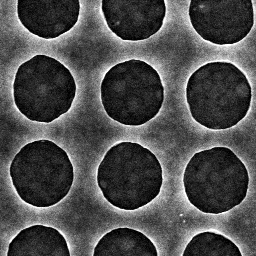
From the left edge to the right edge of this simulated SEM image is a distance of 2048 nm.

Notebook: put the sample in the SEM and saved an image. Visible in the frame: holes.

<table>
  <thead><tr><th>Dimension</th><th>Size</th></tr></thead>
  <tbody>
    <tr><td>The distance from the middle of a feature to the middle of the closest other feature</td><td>677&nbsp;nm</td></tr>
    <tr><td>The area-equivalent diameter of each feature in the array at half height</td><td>0.524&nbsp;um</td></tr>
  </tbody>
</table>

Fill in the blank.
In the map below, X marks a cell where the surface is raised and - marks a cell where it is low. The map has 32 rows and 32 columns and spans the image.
XX--------XXX--------XXX--------
XX--------XXX--------XXX--------
XX--------XXX-------XXXX--------
XXX------XXXXX------XXXX-------X
XXXXX--XXXXXXXX----XXXXXX------X
XXXXXXXXXXXXXXXXXXXXXXXXXXX--XXX
XXXXXXXXXXXXXXXXXXXXXXXXXXXXXXXX
XXXX---XXXXXXXXX-XXXXXXXXXXXXXXX
XX------XXXXXX-----XXXXXX-----XX
XX-------XXXX-------XXXX-------X
XX-------XXXX-------XXX--------X
XX-------XXXX-------XXX--------X
XX-------XXXX-------XXX--------X
XX-------XXXX-------XXXX-------X
XXX----XXXXXXX-----XXXXX-------X
XXXXXXXXXXXXXXX---XXXXXXX-----XX
XXXXXXXXXXXXXXXXXXXXXXXXXXXXXXXX
XXXXX-XXXXXXXXXXXXXXXXXXXXXXXXXX
XXX-----XXXXXX----XXXXXXXXX-XXXX
XX------XXXXX------XXXXX------XX
X--------XXX--------XXX-------XX
X--------XXX--------XXX--------X
X--------XXX--------XXX--------X
XX-------XXX--------XXX--------X
XX------XXXXX-------XXX--------X
XXX----XXXXXXX----XXXXXX------XX
XXXXXXXXXXXXXXXXXXXXXXXXX---XXXX
XXXXXXXXXXXXXXXXXXXXXXXXXXXXXXXX
XXX----XXXXXXXX-XXXXXXXXXXXXXXXX
XX------XXXXX-----XXXXXX----XXXX
X-------XXXX-------XXXX------XXX
X--------XXX--------XXX-------XX